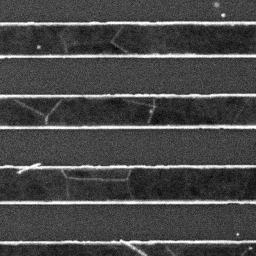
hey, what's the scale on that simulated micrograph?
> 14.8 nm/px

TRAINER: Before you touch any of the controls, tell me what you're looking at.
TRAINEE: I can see lines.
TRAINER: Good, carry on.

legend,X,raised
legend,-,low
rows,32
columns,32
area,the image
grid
--------------------------------
--------------------------------
--------------------------------
XXXXXXXXXXXXXXXXXXXXXXXXXXXXXXXX
XXXXXXXXXXXXXXXXXXXXXXXXXXXXXXXX
XXXXXXXXXXXXXXXXXXXXXXXXXXXXXXXX
XXXXXXXXXXXXXXXXXXXXXXXXXXXXXXXX
--------------------------------
--------------------------------
--------------------------------
--------------------------------
--------------------------------
XXXXXXXXXXXXXXXXXXXXXXXXXXXXXXXX
XXXXXXXXXXXXXXXXXXXXXXXXXXXXXXXX
XXXXXXXXXXXXXXXXXXXXXXXXXXXXXXXX
XXXXXXXXXXXXXXXXXXXXXXXXXXXXXXXX
--------------------------------
--------------------------------
--------------------------------
--------------------------------
--------------------------------
XXXXXXXXXXXXXXXXXXXXXXXXXXXXXXXX
XXXXXXXXXXXXXXXXXXXXXXXXXXXXXXXX
XXXXXXXXXXXXXXXXXXXXXXXXXXXXXXXX
XXXXXXXXXXXXXXXXXXXXXXXXXXXXXXXX
--------------------------------
--------------------------------
--------------------------------
--------------------------------
--------------------------------
XXXXXXXXXXXXXXXXXXXXXXXXXXXXXXXX
XXXXXXXXXXXXXXXXXXXXXXXXXXXXXXXX